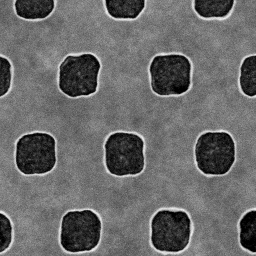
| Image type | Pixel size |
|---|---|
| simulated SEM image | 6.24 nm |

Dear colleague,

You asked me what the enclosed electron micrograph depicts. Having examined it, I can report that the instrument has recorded holes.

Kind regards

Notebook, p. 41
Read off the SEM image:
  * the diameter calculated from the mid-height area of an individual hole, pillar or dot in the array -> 270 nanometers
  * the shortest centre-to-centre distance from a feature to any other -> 558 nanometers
